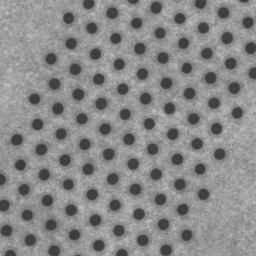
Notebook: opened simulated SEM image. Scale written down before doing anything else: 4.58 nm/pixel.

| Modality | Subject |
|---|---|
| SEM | a regular array of holes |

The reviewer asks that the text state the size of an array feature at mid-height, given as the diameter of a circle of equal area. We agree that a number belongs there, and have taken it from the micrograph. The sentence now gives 0.0539 microns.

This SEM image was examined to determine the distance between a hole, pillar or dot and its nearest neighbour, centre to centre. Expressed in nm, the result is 114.